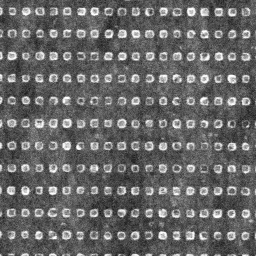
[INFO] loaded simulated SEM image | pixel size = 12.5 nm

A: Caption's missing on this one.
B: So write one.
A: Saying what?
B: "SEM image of a regular array of raised bodies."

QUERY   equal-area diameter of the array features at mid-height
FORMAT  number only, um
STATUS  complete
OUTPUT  0.0892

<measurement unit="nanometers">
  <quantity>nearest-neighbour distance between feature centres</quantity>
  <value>169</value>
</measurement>